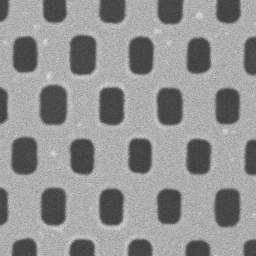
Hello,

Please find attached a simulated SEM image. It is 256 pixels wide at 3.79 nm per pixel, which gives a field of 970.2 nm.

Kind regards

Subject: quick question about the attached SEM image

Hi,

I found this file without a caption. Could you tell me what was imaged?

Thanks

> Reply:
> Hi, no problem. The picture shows a regular array of holes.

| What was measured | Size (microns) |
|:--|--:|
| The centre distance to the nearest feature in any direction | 0.219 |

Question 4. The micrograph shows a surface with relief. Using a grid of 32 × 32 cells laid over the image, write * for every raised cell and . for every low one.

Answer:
.****...****....****...****...**
.****...****....****...****...**
******..*****..*****...****...**
********************************
*********..*********************
**...****...****...*****..*****.
**...****...****...****...****..
**...****...****...****...****..
**..*****...****...****...*****.
********************************
********************************
.****...*****..*****...****...**
.****...****....****...****...**
.****...****....****...****...**
.****...****....****...****...**
******..*****..*****..******.***
********************************
**..*****..******.******..*****.
*....****...****...****...*****.
*....****...****...****...*****.
*....****...****...****...*****.
**..*****..******.******..*****.
********************************
******..********************.***
.****...****...*****...****...**
.****...****...*****...****...**
.****...****...*****...****...**
.****...*****..*****..*****...**
********************************
********************************
**...****...****...****...*****.
**...****...****...****...****..